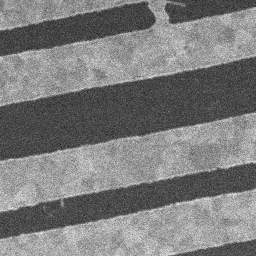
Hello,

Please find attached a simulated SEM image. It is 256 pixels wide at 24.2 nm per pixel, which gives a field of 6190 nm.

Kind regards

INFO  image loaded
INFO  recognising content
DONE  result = one or a few lines or trenches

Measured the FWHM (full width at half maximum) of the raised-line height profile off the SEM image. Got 1.13 µm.